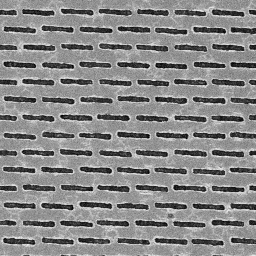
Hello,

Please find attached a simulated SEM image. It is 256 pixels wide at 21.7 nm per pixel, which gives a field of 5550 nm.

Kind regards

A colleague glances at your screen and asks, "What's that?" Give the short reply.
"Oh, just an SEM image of a regular array of holes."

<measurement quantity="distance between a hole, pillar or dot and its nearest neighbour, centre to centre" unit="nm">545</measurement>